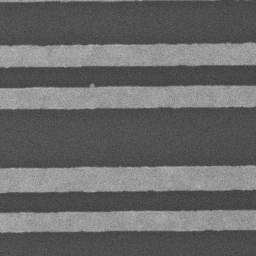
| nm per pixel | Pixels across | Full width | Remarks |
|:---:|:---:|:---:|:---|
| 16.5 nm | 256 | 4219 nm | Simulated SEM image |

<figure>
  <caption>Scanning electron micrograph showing lines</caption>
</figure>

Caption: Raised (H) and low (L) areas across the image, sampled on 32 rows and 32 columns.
LLLLLLLLLLLLLLLLLLLLLLLLLLLLLLLL
LLLLLLLLLLLLLLLLLLLLLLLLLLLLLLLL
LLLLLLLLLLLLLLLLLLLLLLLLLLLLLLLL
LLLLLLLLLLLLLLLLLLLLLLLLLLLLLLLL
LLLLLLLLLLLLLLLLLLLLLLLLLLLLLLLL
LLLLLLLLLLLLLLLLLLLLLLLLLLLLHLHH
HHHHHHHHHHHHHHHHHHHHHHHHHHHHHHHH
HHHHHHHHHHHHHHHHHHHHHHHHHHHHHHHH
LLLLLLLLLLLLLLLLLLLLLLLLLLLLLLLL
LLLLLLLLLLLLLLLLLLLLLLLLLLLLLLLL
LLLLLLLLLLLLLLLLLLLLLLLLLLLLLLLL
HHHHHHHHHHHHHHHHHHHHHHHHHHHHHHHH
HHHHHHHHHHHHHHHHHHHHHHHHHHHHHHHH
HHHHHHHHHHHHLLLLLLLLLLLLLLLLLLLL
LLLLLLLLLLLLLLLLLLLLLLLLLLLLLLLL
LLLLLLLLLLLLLLLLLLLLLLLLLLLLLLLL
LLLLLLLLLLLLLLLLLLLLLLLLLLLLLLLL
LLLLLLLLLLLLLLLLLLLLLLLLLLLLLLLL
LLLLLLLLLLLLLLLLLLLLLLLLLLLLLLLL
LLLLLLLLLLLLLLLLLLLLLLLLLLLLLLLL
LLLLLLLLLLLLLLLLLLLLLLLLLLLLLLLL
HHHHHHHHHHHHHHHHHHHHHHHHHHHHHHHH
HHHHHHHHHHHHHHHHHHHHHHHHHHHHHHHH
HHHHHHHHHHHHHHHHHHHHHHHHHHHHHHHH
LLLLLLLLLLLLLLLLLLLLLLLLLLLLLLLL
LLLLLLLLLLLLLLLLLLLLLLLLLLLLLLLL
LLLLLLLLLLLLLLHHHHHHHHHHHHHHHHHH
HHHHHHHHHHHHHHHHHHHHHHHHHHHHHHHH
HHHHHHHHHHHHHHHHHHHHHHHHHHHHHHHH
LLLLLLLLLLLLLLLLLLLLLLLLLLLLLLLL
LLLLLLLLLLLLLLLLLLLLLLLLLLLLLLLL
LLLLLLLLLLLLLLLLLLLLLLLLLLLLLLLL